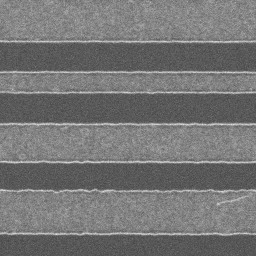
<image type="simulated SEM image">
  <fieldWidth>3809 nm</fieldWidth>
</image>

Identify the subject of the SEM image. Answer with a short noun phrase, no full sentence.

one or a few lines or trenches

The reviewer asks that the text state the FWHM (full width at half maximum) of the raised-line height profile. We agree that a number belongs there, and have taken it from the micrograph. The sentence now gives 465 nm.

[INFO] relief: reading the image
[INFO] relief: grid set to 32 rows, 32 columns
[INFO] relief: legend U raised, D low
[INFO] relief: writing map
DDDDDDDDDDDDDDDDDDDDDDDDDDDDDDDD
DDDDDDDDDDDDDDDDDDDDDDDDDDDDDDDD
DDDDDDDDDDDDDDDDDDDDDDDDDDDDDDDD
DDDDDDDDDDDDDDDDDDDDDDDDDDDDDDDD
DDDDDDDDDDDDDDDDDDDDDDDDDDDDDDDD
UUUUUUUUUUUUUUUUUUUUUUUUUUUUUUUU
UUUUUUUUUUUUUUUUUUUUUUUUUUUUUUUU
UUUUUUUUUUUUUUUUUUUUUUUUUUUUUUUU
UUUUUUUUUUUUUUUUUUUUUUUUUUUUUUUU
DDDDDDDDDDDDDDDDDDDDDDDDDDDDDDDD
DDDDDDDDDDDDDDDDDDDDDDDDDDDDDDDD
DDDDDDDDDDDDDDDDDDDDDDDDDDDDDDDD
UUUUUUUUUUUUUUUUUUUUUUUUUUUUUUUU
UUUUUUUUUUUUUUUUUUUUUUUUUUUUUUUU
UUUUUUUUUUUUUUUUUUUUUUUUUUUUUUUU
UUUUUUUUUUUUUUUUUUUUUUUUUUUUUUUU
DDDDDDDDDDDDDDDDDDDDDDDDDDDDDDDD
DDDDDDDDDDDDDDDDDDDDDDDDDDDDDDDD
DDDDDDDDDDDDDDDDDDDDDDDDDDDDDDDD
DDDDDDDDDDDDDDDDDDDDDDDDDDDDDDDD
UUUUUUUUUUUUUUUUUUUUUUUUUUUUUUUU
UUUUUUUUUUUUUUUUUUUUUUUUUUUUUUUU
UUUUUUUUUUUUUUUUUUUUUUUUUUUUUUUU
UUUUUUUUUUUUUUUUUUUUUUUUUUUUUUUU
DDDDDDDDDDDDDDDDDDDDDDDDDDDDDDDD
DDDDDDDDDDDDDDDDDDDDDDDDDDDDDDDD
DDDDDDDDDDDDDDDDDDDDDDDDDDDDDDDD
DDDDDDDDDDDDDDDDDDDDDDDDDDDDDDDD
DDDDDDDDDDDDDDDDDDDDDDDDDDDDDDDD
UUUUUUUUUUUUUUUUUUUUUUUUUUUUUUUU
UUUUUUUUUUUUUUUUUUUUUUUUUUUUUUUU
UUUUUUUUUUUUUUUUUUUUUUUUUUUUUUUU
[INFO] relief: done